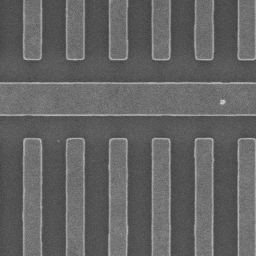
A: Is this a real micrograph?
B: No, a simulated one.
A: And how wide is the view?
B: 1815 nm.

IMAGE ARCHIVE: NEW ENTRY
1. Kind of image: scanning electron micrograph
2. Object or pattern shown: groups of lines, slits or small figures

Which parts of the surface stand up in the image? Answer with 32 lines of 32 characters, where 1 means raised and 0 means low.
00011000110000110001100011100011
00011000110000110001100011100011
00011000110000110001100011100011
00011000110000110001100011100011
00011000110000110001100011100011
00011000110000110001100011100011
00011000110000110001100011100011
00000000000000000000000000000000
00000000000000000000000000000000
00000000000000000000000000000000
11111111111111111111111111111111
11111111111111111111111111111111
11111111111111111111111111111111
11111111111111111111111111111111
00000000000000000000000000000000
00000000000000000000000000000000
00000000000000000000000000000000
00011000010000110001100001000011
00011000110000110001100011100011
00011000110000110001100011100011
00011000110000110001100011100011
00011000110000110001100011100011
00011000110000110001100011100011
00011000110000110001100011100011
00011000110000110001100011100011
00011000110000110001100011100011
00011000110000110001100011100011
00011000110000110001100011100011
00011000110000110001100011100011
00011000110000110001100011100011
00011000110000110001100011100011
00011000110000110001100011100011